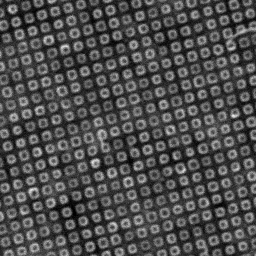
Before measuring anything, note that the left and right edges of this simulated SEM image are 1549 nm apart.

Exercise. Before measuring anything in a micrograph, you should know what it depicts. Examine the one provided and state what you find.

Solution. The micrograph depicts a regular array of raised bodies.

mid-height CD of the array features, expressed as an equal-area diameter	53.7	nm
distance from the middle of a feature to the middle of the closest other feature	0.0786	microns